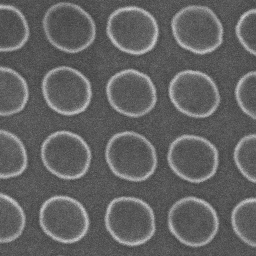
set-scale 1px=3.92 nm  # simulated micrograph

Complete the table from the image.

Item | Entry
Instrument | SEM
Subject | a regular array of raised bodies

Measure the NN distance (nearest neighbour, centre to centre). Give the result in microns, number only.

0.247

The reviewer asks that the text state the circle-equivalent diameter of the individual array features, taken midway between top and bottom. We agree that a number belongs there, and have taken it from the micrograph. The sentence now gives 188 nanometres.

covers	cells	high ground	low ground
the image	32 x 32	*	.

.......**.......................
**....*****...****.....***.....*
***...*****...*****...*****...**
***...******.*******..******..**
***...******..******..******..**
***....****...*****...*****...**
................**......**.....*
................................
.......**.......................
**....****....****....****.....*
***..******...*****..******...**
***..******..******..******...**
***...*****...*****..******...**
***....****...*****...*****...**
........................**.....*
................................
*...............................
**....****....****....****....**
***..******..******..******...**
***..******..******..******..***
***...*****...*****..******...**
***....****...*****...*****...**
.................*......**.....*
................................
*...............................
**....****....****....****....**
***..******..******..******..***
***..******..******..******..***
***..******..******..******..***
**....****....*****...*****...**
................*.......**.....*
................................